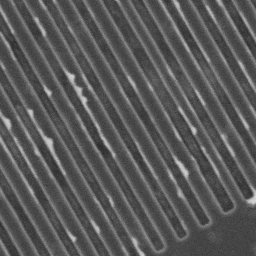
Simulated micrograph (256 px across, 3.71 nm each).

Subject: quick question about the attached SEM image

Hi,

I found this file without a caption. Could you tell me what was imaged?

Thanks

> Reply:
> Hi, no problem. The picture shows parallel lines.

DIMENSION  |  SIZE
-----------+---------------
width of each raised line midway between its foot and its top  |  60.7 nm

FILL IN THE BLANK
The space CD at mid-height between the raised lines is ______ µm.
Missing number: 0.035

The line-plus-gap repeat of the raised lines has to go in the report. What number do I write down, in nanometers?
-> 96